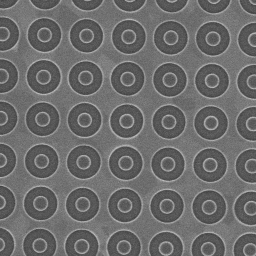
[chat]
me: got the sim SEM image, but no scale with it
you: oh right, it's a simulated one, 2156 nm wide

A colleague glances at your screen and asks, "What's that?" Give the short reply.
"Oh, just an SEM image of an array of small figures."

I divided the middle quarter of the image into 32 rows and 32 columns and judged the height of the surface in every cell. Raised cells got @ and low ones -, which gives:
@@------@@@@@------@@@@@-----@@@
@@-------@@@--------@@@-------@@
@---@@@---@@---@@---@@---@@@--@@
@---@@@---@@--@@@@--@@---@@@---@
@---@@@---@@--@@@---@@---@@@---@
@@-------@@@--------@@----@---@@
@@-------@@@@------@@@@-------@@
@@@@---@@@@@@@----@@@@@@-----@@@
@@@@@@@@@@@@@@@@@@@@@@@@@@@@@@@@
@@@@@@@@@@@@@@@@@@@@@@@@@@@@@@@@
@@@-----@@@@@@----@@@@@@@---@@@@
@@-------@@@@------@@@@------@@@
@---@@---@@@--------@@--------@@
@---@@@---@---@@@---@@---@@@--@@
@---@@@--@@---@@@---@@---@@@---@
@---@@---@@@--@@@---@@---@@@--@@
@@-------@@@-------@@@@-------@@
@@@-----@@@@@-----@@@@@------@@@
@@@@@@@@@@@@@@---@@@@@@@@---@@@@
@@@@@@@@@@@@@@@@@@@@@@@@@@@@@@@@
@@@---@@@@@@@@@-@@@@@@@@@@@@@@@@
@@------@@@@@-----@@@@@@----@@@@
@--------@@@-------@@@@------@@@
@---@@---@@---@@@---@@---@@---@@
@--@@@@--@@---@@@---@@--@@@@--@@
@---@@---@@---@@@---@@--@@@@--@@
@--------@@@-------@@@---@@---@@
@@------@@@@-------@@@@-------@@
@@@---@@@@@@@-----@@@@@@-----@@@
@@@@@@@@@@@@@@@@@@@@@@@@@@@@@@@@
@@@@@@@@@@@@@@@@@@@@@@@@@@@@@@@@
@@-----@@@@@@----@@@@@@@@--@@@@@